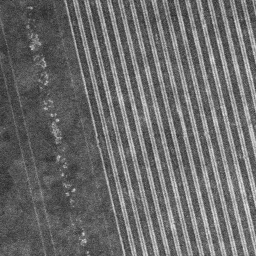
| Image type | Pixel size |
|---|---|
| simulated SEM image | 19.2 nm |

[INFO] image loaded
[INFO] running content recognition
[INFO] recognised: parallel lines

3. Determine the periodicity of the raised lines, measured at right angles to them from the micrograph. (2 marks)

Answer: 210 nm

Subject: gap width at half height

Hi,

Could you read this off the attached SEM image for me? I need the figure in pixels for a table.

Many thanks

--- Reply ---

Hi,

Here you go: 8.4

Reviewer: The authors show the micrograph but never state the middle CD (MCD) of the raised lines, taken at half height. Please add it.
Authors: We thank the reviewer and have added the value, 53.8 nanometres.